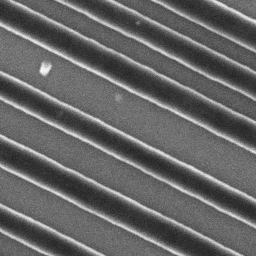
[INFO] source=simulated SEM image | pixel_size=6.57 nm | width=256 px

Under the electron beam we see lines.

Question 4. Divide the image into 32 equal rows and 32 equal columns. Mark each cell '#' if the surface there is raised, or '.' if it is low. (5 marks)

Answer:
##......#######.....########....
####......#######.....########..
#######.....#######.....########
.#######......#######.....######
...#######......#######.....####
.....#######......#######.....##
.......########.....#######.....
.........#######......#######...
...........########.....#######.
#............########.....######
###...........########......####
#####............########.....##
#######............#######......
..#######............#######....
....#######............########.
......#######............#######
........#######............#####
#.........#######............###
###.........#######............#
######........#######...........
#######.........#######.........
.#########........#######.......
...########.........#######.....
.....########.........#######...
........########........#######.
.........########.........######
##.........#########........####
####.........########.........##
######..........########........
.#######..........########......
...#######.........########.....
.....#######.........########...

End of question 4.